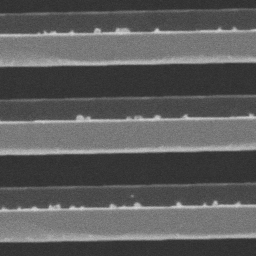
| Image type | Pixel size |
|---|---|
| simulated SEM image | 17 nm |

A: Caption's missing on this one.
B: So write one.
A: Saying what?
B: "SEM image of lines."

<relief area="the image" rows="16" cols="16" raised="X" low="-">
----------------
XXXXXXXXXXXXXXXX
XXXXXXXXXXXXXXXX
XXXXXXXXXXXXXXXX
----------------
----------------
XXXXXXXXXXXXXXXX
XXXXXXXXXXXXXXXX
XXXXXXXXXXXXXXXX
XXXXXXXXXX------
----------------
-------------XXX
XXXXXXXXXXXXXXXX
XXXXXXXXXXXXXXXX
XXXXXXXXXXXXXXXX
----------------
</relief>